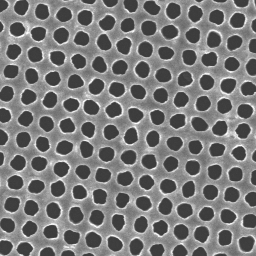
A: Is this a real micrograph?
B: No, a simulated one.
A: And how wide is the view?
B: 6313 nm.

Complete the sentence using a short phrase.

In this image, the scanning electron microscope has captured a regular array of holes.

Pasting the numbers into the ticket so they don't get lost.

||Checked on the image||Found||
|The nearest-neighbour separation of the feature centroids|512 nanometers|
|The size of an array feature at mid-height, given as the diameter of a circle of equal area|15.2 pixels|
